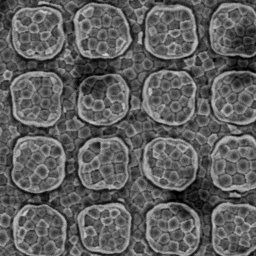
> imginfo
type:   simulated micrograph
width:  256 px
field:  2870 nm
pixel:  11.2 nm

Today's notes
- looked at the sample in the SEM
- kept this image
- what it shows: a regular array of raised bodies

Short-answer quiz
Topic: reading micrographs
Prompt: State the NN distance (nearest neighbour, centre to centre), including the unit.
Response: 721 nanometres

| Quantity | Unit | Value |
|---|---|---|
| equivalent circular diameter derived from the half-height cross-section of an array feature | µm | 0.61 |